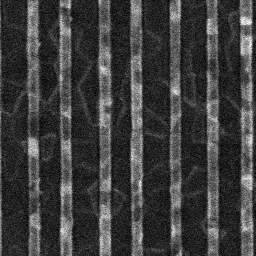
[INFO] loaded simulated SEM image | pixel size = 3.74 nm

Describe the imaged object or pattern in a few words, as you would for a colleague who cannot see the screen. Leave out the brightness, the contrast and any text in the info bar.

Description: parallel lines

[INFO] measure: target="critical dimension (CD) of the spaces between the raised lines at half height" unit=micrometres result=0.103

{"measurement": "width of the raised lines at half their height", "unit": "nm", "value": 37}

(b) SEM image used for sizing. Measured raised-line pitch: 0.133 um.